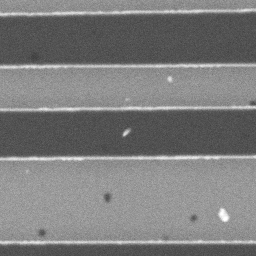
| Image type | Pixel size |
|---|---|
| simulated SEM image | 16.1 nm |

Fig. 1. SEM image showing lines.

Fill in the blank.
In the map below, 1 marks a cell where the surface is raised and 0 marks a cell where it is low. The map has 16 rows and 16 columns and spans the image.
0000000000000000
1111111111111111
1111111111111111
1111111111111111
0000000000000000
0000000000000000
0000000000000000
1111111111111111
1111111111111111
1111111111111111
0000000000000000
0000000000000000
0000000000000000
0000000000000000
0000000000000000
1111111111111111